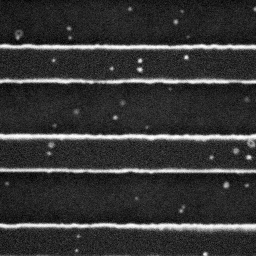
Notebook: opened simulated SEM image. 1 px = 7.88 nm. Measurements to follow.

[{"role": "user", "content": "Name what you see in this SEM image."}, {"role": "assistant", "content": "lines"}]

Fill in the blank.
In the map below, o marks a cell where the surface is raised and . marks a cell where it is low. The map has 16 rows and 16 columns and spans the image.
................
................
................
oooooooooooooooo
oooooooooooooooo
................
................
................
oooooo..o.......
oooooooooooooooo
oooooooooooooooo
................
................
................
oooooooooooooooo
oooooooooooooooo